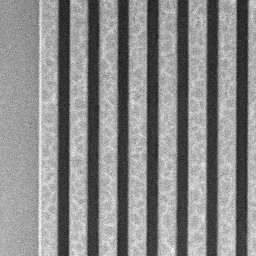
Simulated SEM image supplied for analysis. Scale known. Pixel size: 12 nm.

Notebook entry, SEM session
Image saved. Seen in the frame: parallel lines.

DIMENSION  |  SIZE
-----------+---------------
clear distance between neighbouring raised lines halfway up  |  147 nanometers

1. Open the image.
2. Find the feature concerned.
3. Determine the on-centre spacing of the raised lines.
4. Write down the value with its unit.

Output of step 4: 356 nanometres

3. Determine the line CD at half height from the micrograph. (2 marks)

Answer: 214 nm